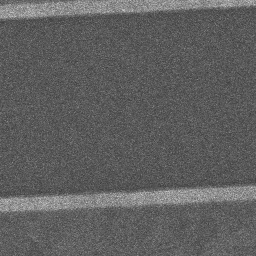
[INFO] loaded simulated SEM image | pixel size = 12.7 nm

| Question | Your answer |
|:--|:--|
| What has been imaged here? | one or a few lines or trenches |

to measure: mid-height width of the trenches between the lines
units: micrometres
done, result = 2.47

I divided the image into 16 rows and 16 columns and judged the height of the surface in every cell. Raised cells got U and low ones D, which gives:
UUUUDDDDDDDDDDDD
DDDDDDDDDDDDDDDD
DDDDDDDDDDDDDDDD
DDDDDDDDDDDDDDDD
DDDDDDDDDDDDDDDD
DDDDDDDDDDDDDDDD
DDDDDDDDDDDDDDDD
DDDDDDDDDDDDDDDD
DDDDDDDDDDDDDDDD
DDDDDDDDDDDDDDDD
DDDDDDDDDDDDDDDD
DDDDDDDDDDDDDDDD
DDDDDDDDUUUUUUUU
UUUUUUUUUUUUUUUU
UUUUUUUUUUUUUUUU
UUUUUUUUUUUUUUUU